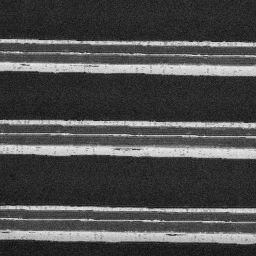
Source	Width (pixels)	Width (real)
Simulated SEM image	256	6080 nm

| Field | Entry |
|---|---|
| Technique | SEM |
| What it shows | lines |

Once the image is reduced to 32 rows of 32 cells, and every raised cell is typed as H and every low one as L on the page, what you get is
LLLLLLLLLLLLLLLLLLLLLLLLLLLLLLLL
LLLLLLLLLLLLLLLLLLLLLLLLLLLLLLLL
LLLLLLLLLLLLLLLLLLLLLLLLLLLLLLLL
LLLLLLLLLLLLLLLLLLLLLLLLLLLLLLLL
LLLLLLLLLLLLLLLLLLLLLLLLLLLLLLLL
HHHHHHHHHHHHHHHHHHHLLLLLLLLLLLLL
HHHHHHHHHHHHHHHHHHHHHHHHHHHHHHHH
HHHHHHHHHHHHHHHHHHHHHHHHHHHHHHHH
LLLLLLLLLLLLLLLLLLHHHHHHHHHHHHHH
LLLLLLLLLLLLLLLLLLLLLLLLLLLLLLLL
LLLLLLLLLLLLLLLLLLLLLLLLLLLLLLLL
LLLLLLLLLLLLLLLLLLLLLLLLLLLLLLLL
LLLLLLLLLLLLLLLLLLLLLLLLLLLLLLLL
LLLLLLLLLLLLLLLLLLLLLLLLLLLLLLLL
LLLLLLLLLLLLLLLLLLLLLLLLLLLLLLLL
HHHHHHHHHHHHLLLLLLLLLLLLLLLLLLLL
HHHHHHHHHHHHHHHHHHHHHHHHHHHHHHHH
HHHHHHHHHHHHHHHHHHHHHHHHHHHHHHHH
HHHHHHHHHHHHHHHHHHHHHHHHHHHHHHHH
LLLLLLLLLLLLLLLLLLLLLLLLLLLLLLLL
LLLLLLLLLLLLLLLLLLLLLLLLLLLLLLLL
LLLLLLLLLLLLLLLLLLLLLLLLLLLLLLLL
LLLLLLLLLLLLLLLLLLLLLLLLLLLLLLLL
LLLLLLLLLLLLLLLLLLLLLLLLLLLLLLLL
LLLLLLLLLLLLLLLLLLLLLLLLLLLLLLLL
LLLLLLLLLLLLLLLLLLLLLLLLLLLLLLLL
HHHHHHHHHHHHHHHHHHHHHHHHHHHHHHHL
HHHHHHHHHHHHHHHHHHHHHHHHHHHHHHHH
HHHHHHHHHHHHHHHHHHHHHHHHHHHHHHHH
LLLLLLLLLLLLLHHHHHHHHHHHHHHHHHHH
LLLLLLLLLLLLLLLLLLLLLLLLLLLLLLLL
LLLLLLLLLLLLLLLLLLLLLLLLLLLLLLLL